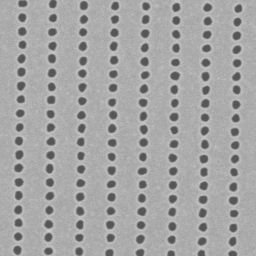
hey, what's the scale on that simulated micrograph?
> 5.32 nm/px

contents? a regular array of holes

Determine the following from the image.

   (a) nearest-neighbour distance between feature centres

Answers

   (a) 71.4 nm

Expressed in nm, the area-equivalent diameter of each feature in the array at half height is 42.9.